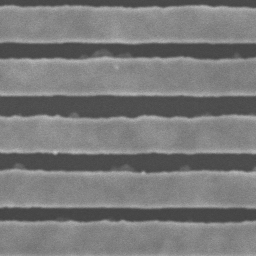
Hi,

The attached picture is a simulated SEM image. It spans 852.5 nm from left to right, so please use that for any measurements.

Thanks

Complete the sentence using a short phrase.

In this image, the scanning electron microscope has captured lines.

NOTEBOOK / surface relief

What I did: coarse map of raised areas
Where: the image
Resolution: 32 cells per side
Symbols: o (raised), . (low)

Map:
................................
oooooooooooooooooooooooooooooooo
oooooooooooooooooooooooooooooooo
oooooooooooooooooooooooooooooooo
oooooooooooooooooooooooooooooooo
................................
................................
oooooooooooooooooooooooooooooooo
oooooooooooooooooooooooooooooooo
oooooooooooooooooooooooooooooooo
oooooooooooooooooooooooooooooooo
oooooooooooooooooooooooooooooooo
................................
................................
.o..oo.o..........oo......oooooo
oooooooooooooooooooooooooooooooo
oooooooooooooooooooooooooooooooo
oooooooooooooooooooooooooooooooo
oooooooooooooooooooooooooooooooo
................................
................................
ooooooooooo.oooo......ooooooooo.
oooooooooooooooooooooooooooooooo
oooooooooooooooooooooooooooooooo
oooooooooooooooooooooooooooooooo
oooooooooooooooooooooooooooooooo
................................
................................
oooooooooooooooooooooooooooooooo
oooooooooooooooooooooooooooooooo
oooooooooooooooooooooooooooooooo
oooooooooooooooooooooooooooooooo